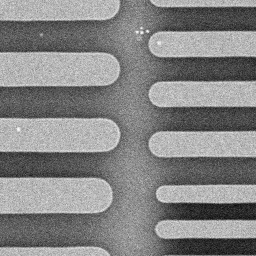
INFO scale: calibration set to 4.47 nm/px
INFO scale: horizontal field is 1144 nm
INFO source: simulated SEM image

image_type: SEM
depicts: groups of lines, slits or small figures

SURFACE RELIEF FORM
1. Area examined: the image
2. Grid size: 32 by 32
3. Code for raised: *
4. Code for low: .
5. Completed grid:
***************....*************
***************.................
*********.......................
................................
...................*************
...................*************
...................*************
***************.................
***************.................
***************.................
**************.....*************
...................*************
...................*************
................................
................................
**************..................
***************................*
***************....*************
**************.....*************
....................************
................................
................................
*************...................
**************......************
**************......************
**************..................
************....................
................................
....................************
....................************
................................
*************...................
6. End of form